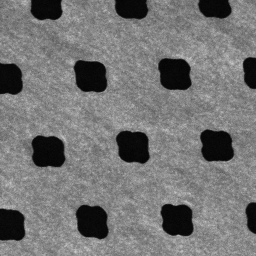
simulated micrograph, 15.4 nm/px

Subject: holes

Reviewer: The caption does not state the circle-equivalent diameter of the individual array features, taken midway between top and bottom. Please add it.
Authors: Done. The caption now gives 522 nm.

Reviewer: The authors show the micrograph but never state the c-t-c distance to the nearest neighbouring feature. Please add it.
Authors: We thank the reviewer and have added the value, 1280 nm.